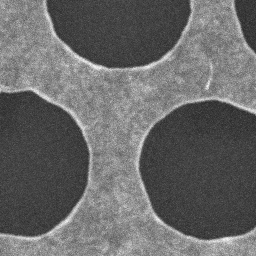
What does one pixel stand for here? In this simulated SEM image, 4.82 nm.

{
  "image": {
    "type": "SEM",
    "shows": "holes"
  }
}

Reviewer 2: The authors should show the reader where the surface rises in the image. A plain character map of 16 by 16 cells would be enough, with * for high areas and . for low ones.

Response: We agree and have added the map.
***.........***.
***.........***.
****.......****.
*****.....******
****************
****************
...*********..**
.....*****......
.....****.......
......***.......
......***.......
.....****.......
.....****.......
....******......
...********.....
****************